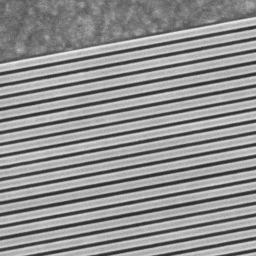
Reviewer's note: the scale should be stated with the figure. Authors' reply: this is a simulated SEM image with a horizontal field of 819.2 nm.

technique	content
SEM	parallel lines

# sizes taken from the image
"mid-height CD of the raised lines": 22.3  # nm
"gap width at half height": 12.9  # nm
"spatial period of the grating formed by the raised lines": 36.9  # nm